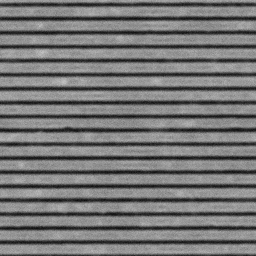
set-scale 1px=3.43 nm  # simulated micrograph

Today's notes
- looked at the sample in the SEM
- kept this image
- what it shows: parallel lines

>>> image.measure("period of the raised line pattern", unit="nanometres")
47.8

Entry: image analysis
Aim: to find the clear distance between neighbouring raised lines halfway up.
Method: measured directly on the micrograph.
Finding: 16.3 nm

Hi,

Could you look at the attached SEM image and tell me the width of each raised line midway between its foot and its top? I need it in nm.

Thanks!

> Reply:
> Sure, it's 32.5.